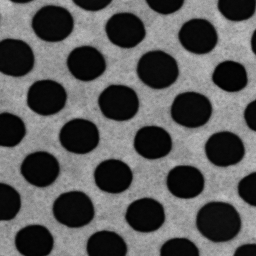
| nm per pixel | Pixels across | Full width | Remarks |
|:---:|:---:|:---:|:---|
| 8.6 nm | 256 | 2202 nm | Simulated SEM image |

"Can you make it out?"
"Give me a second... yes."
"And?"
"a regular array of holes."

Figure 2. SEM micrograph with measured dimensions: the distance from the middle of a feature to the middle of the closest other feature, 439 nm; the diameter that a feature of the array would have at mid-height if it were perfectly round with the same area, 314 nanometers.